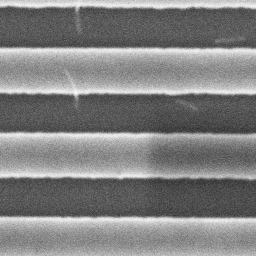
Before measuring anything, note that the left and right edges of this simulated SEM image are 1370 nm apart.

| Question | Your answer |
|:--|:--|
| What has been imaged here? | lines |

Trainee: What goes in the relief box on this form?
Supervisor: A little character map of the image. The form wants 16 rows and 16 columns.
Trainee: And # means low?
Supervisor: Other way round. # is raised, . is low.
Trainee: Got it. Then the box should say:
................
................
................
################
################
################
................
................
################
################
################
................
................
................
################
################